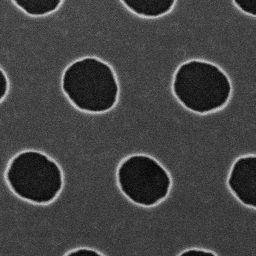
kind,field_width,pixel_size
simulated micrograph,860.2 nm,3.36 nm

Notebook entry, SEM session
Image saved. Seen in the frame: holes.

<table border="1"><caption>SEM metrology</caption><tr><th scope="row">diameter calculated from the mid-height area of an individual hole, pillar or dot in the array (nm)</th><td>178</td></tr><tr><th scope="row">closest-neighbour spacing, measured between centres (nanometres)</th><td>364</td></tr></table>